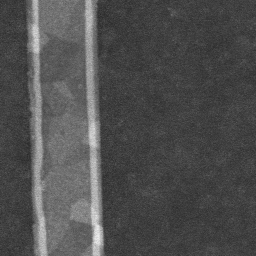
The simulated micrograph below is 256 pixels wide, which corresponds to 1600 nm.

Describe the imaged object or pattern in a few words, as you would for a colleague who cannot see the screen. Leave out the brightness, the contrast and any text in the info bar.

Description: one or a few lines or trenches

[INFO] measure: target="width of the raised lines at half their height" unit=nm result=338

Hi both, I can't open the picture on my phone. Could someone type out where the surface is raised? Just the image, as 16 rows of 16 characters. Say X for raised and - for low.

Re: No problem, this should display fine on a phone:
--XXXX----------
--XXXX----------
--XXXX----------
--XXXX----------
--XXXX----------
--XXXX----------
--XXXX----------
--XXXX----------
--XXXX----------
--XXXX----------
--XXXX----------
--XXXX----------
--XXXX----------
---XXX----------
---XXX----------
---XXX----------